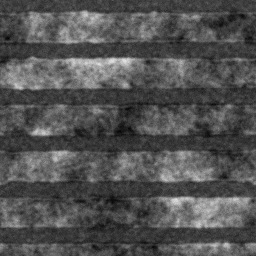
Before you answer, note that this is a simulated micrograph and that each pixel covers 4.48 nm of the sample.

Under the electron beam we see parallel lines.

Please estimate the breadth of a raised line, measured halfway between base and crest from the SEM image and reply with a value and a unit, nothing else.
128 nanometres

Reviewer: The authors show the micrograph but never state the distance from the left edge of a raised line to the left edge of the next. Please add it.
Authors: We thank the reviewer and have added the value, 207 nm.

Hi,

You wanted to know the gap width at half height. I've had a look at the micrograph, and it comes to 80.2 nm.